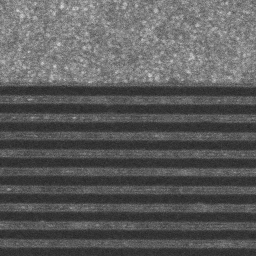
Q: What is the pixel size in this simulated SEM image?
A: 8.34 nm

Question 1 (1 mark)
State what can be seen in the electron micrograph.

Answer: parallel lines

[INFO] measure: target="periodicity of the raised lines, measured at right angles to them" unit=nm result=150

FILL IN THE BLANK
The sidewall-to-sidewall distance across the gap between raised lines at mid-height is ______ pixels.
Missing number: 5.74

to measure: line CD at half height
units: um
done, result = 0.101